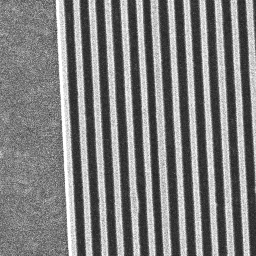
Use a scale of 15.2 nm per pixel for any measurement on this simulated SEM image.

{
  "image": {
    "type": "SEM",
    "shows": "parallel lines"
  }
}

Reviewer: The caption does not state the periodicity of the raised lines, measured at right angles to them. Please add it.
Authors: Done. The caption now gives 239 nm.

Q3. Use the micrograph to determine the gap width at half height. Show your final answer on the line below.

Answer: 133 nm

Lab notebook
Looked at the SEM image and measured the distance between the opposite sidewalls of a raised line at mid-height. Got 106 nm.